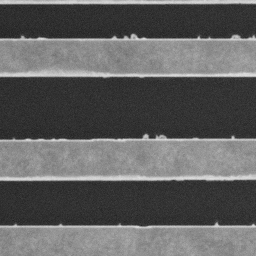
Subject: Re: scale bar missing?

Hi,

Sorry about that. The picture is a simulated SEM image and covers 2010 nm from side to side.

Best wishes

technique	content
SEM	lines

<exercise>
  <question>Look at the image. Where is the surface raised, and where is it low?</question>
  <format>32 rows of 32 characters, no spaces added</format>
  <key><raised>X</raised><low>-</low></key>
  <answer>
--------------------------------
--------------------------------
--------------------------------
--------------------------------
--------------------------------
XXXXXXXXXXXXXXXXXXXXXXXXXXXXXXXX
XXXXXXXXXXXXXXXXXXXXXXXXXXXXXXXX
XXXXXXXXXXXXXXXXXXXXXXXXXXXXXXXX
XXXXXXXXXXXXXXXXXXXXXXXXXXXXXXXX
-------------XXXXXXXXXXXXXXX----
--------------------------------
--------------------------------
--------------------------------
--------------------------------
--------------------------------
--------------------------------
--------------------------------
---XXXXXX--XXXXXXXXXXXXXXXXXXXXX
XXXXXXXXXXXXXXXXXXXXXXXXXXXXXXXX
XXXXXXXXXXXXXXXXXXXXXXXXXXXXXXXX
XXXXXXXXXXXXXXXXXXXXXXXXXXXXXXXX
XXXXXXXXXXXXXXXXXXXXXXXXXXXXXXXX
--------------------------------
--------------------------------
--------------------------------
--------------------------------
--------------------------------
--------------------------------
XXXXXXXXXXXXXXXXXXXXXXXXXXXXXXXX
XXXXXXXXXXXXXXXXXXXXXXXXXXXXXXXX
XXXXXXXXXXXXXXXXXXXXXXXXXXXXXXXX
XXXXXXXXXXXXXXXXXXXXXXXXXXXXXXXX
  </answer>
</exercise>